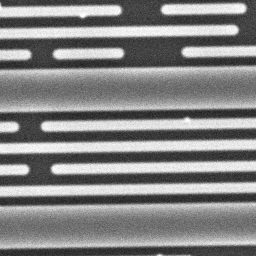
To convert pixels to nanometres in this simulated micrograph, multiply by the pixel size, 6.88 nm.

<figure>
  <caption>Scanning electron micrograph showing groups of lines, slits or small figures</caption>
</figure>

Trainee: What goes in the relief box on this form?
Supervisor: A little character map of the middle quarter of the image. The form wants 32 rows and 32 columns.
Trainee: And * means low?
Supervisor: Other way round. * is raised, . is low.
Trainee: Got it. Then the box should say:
................................
********************************
********************************
********************************
********************************
********************************
********************************
********************************
********************************
********************************
********************************
****************................
................................
..............................*.
********************************
********************************
*****...........................
................................
................................
........................********
********************************
********************************
................................
................................
................................
********************************
********************************
................................
................................
................................
..........**********************
********************************